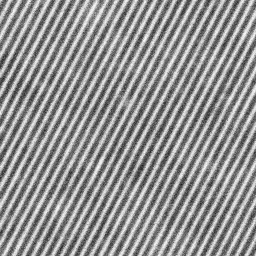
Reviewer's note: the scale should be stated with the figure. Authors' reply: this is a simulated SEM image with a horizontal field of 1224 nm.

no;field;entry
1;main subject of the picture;parallel lines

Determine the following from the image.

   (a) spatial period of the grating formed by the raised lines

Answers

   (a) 41.2 nm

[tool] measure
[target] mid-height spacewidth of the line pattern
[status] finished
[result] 32.9 nm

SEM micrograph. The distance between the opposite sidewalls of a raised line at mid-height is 1.78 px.